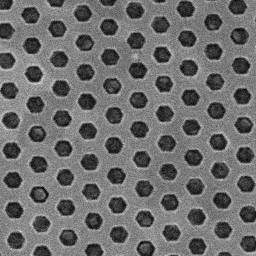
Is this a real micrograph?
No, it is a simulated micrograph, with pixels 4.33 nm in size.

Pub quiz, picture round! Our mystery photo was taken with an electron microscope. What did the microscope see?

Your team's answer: a regular array of holes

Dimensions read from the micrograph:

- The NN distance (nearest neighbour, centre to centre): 126 nm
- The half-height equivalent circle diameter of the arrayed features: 79.4 nm